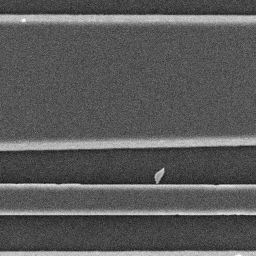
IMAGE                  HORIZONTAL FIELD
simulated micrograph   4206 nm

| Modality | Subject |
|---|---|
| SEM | lines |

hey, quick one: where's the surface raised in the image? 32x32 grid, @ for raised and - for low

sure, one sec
--------------------------------
--------------------------------
@@@@@@@@@@@@@@@@@@@@@@@@@@@@@@@@
@@@@@@@@@@@@@@@@@@@@@@@@@@@@@@@@
@@@@@@@@@@@@@@@@@@@@@@@@@@@@@@@@
@@@@@@@@@@@@@@@@@@@@@@@@@@@@@@@@
@@@@@@@@@@@@@@@@@@@@@@@@@@@@@@@@
@@@@@@@@@@@@@@@@@@@@@@@@@@@@@@@@
@@@@@@@@@@@@@@@@@@@@@@@@@@@@@@@@
@@@@@@@@@@@@@@@@@@@@@@@@@@@@@@@@
@@@@@@@@@@@@@@@@@@@@@@@@@@@@@@@@
@@@@@@@@@@@@@@@@@@@@@@@@@@@@@@@@
@@@@@@@@@@@@@@@@@@@@@@@@@@@@@@@@
@@@@@@@@@@@@@@@@@@@@@@@@@@@@@@@@
@@@@@@@@@@@@@@@@@@@@@@@@@@@@@@@@
@@@@@@@@@@@@@@@@@@@@@@@@@@@@@@@@
@@@@@@@@@@@@@@@@@@@@@@@@@@@@@@@@
@@@@@@@@@@@@@@@@@@@@@@@@@@@@@@@@
--------------------------------
--------------------------------
--------------------------------
--------------------------------
--------------------------------
@@@@@@@@@@@@@@@@@@@@@@@@@@@@@@@@
@@@@@@@@@@@@@@@@@@@@@@@@@@@@@@@@
@@@@@@@@@@@@@@@@@@@@@@@@@@@@@@@@
@@@@@@@@@@@@@@@@@@@@@@@@@@@@@@@@
--------------------------------
--------------------------------
--------------------------------
--------------------------------
--------------------------------